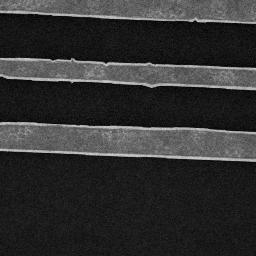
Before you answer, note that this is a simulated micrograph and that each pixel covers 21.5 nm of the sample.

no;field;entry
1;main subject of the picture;one or a few lines or trenches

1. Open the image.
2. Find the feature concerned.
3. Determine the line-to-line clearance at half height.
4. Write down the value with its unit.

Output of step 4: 0.978 micrometres